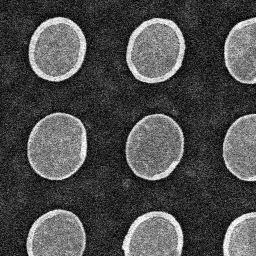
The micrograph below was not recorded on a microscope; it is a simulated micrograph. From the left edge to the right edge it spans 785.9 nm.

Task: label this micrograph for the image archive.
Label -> raised bodies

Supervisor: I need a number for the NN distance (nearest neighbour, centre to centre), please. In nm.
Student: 297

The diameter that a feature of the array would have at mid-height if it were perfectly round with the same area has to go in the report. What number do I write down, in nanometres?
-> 186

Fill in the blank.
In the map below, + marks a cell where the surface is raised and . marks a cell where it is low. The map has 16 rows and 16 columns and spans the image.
................
...++....++....+
..+++...+++...++
..+++...+++...++
..+++...+++...++
................
................
...++....++....+
..+++...+++...++
..+++...+++...++
..+++...+++...++
................
................
...++....++....+
..+++...+++...++
..+++...+++...++